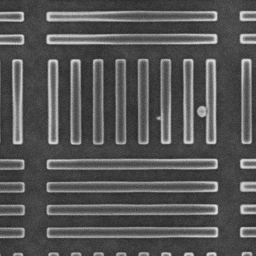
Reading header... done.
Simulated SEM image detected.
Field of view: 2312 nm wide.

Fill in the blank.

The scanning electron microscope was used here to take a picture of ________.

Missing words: groups of lines, slits or small figures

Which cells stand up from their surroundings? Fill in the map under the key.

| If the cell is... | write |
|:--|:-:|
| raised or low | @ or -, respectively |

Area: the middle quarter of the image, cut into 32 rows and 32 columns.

--@@---@@@---@@----@@---@@@---@@
--@@---@@@---@@----@@---@@@---@@
--@@---@@@---@@----@@---@@@---@@
--@@---@@@---@@----@@---@@@---@@
--@@---@@@---@@----@@---@@@---@@
--@@---@@@---@@----@@---@@@---@@
--@@---@@@---@@----@@---@@@---@@
--@@---@@@---@@----@@---@@@---@@
--@@---@@@---@@----@@---@@@---@@
--@@---@@@---@@----@@---@@@---@@
--@@---@@@---@@----@@---@@@---@@
--@@---@@@---@@----@@---@@----@@
--@@---@@@---@@----@@---@@----@@
--@@---@@@---@@----@@---@@----@@
--@@---@@@---@@----@@---@@----@@
--@@---@@@---@@----@@---@@----@@
--@@---@@@---@@----@@---@@----@@
--@@---@@@---@@----@@---@@----@@
--@@---@@@---@@----@@---@@----@@
--@@---@@@---@@----@@----@----@@
--------------------------------
--------------------------------
--------------------------------
--------------------------------
@@@@@@@@@@@@@@@@@@@@@@@@@@@@@@@@
@@@@@@@@@@@@@@@@@@@@@@@@@@@@@@@@
--------------------------------
--------------------------------
--------------------------------
--------------------------------
@@@@@@@@@@@@@@@@@@@@@@@@@@@@@@@@
@@@@@@@@@@@@@@@@@@@@@@@@@@@@@@@@